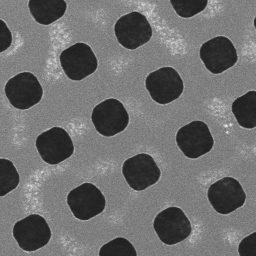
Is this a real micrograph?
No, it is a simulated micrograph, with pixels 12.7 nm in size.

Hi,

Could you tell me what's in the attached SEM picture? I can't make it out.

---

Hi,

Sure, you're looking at a regular array of holes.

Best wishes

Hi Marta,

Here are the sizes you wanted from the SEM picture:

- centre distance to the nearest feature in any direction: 62.1 px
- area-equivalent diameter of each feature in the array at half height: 36.7 px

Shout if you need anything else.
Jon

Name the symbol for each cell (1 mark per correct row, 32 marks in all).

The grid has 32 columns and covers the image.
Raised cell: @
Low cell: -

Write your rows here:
@@@@----@@@@@@@@@@@@@-----@@@@@@
@@@@----@@@@@@@@@@@@@@---@@@@@@@
@@@@@--@@@@@@@@---@@@@@@@@@@@@@@
-@@@@@@@@@@@@@-----@@@@@@@@@@@@@
-@@@@@@@@@@@@@-----@@@@@@@@@@@@@
-@@@@@@@@--@@@@---@@@@@@@----@@@
@@@@@@@@----@@@@@@@@@@@@@-----@@
@@@@@@@@----@@@@@@@@@@@@@-----@@
@@@@@@@@----@@@@@@@@-@@@@@---@@@
@@--@@@@---@@@@@@@-----@@@@@@@@@
@----@@@@@@@@@@@@@-----@@@@@@@@@
@----@@@@@@@@@@@@@@----@@@@@@@@-
@----@@@@@@@@--@@@@---@@@@@@@---
@@--@@@@@@@@----@@@@@@@@@@@@@---
@@@@@@@@@@@-----@@@@@@@@@@@@@---
@@@@@@@@@@@@----@@@@@@@@--@@@@--
@@@@@@--@@@@---@@@@@@@----@@@@@@
@@@@@----@@@@@@@@@@@@@-----@@@@@
@@@@@----@@@@@@@@@@@@@----@@@@@@
@@@@@----@@@@@@@@--@@@@--@@@@@@@
--@@@@-@@@@@@@@-----@@@@@@@@@@@@
--@@@@@@@@@@@@@-----@@@@@@@@@@@@
--@@@@@@@@@@@@@@----@@@@@@@---@@
--@@@@@@@---@@@@@-@@@@@@@@----@@
@@@@@@@@-----@@@@@@@@@@@@@-----@
@@@@@@@@-----@@@@@@@@@@@@@----@@
@@@@@@@@@----@@@@@@@---@@@@--@@@
@@@---@@@@@@@@@@@@@-----@@@@@@@@
@@----@@@@@@@@@@@@@-----@@@@@@@@
@@----@@@@@@@@@@@@@@----@@@@@@@-
@@----@@@@@@@---@@@@@-@@@@@@@@--
@@@@@@@@@@@@-----@@@@@@@@@@@@@--